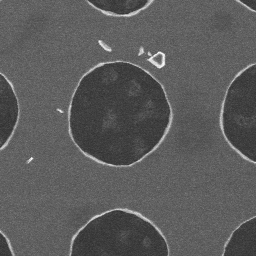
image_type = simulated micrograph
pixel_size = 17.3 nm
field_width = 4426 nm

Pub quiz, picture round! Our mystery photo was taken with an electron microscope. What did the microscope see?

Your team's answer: holes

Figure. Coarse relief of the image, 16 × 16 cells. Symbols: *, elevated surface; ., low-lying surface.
******...*******
****************
****************
****************
******...******.
.****.....****..
.***.......***..
.***.......***..
.***......****..
*****....******.
****************
****************
****************
******...*******
*****.....*****.
.***......****..